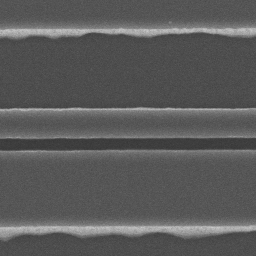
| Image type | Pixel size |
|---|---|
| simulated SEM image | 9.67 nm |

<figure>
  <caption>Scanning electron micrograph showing lines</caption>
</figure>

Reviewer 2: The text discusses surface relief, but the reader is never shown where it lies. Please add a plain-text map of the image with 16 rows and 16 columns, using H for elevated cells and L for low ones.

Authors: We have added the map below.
HHHHHHHHHHHHHHHH
HHHHHHHHHHHHHHHH
LLLLLLLLLLLLLLLL
LLLLLLLLLLLLLLLL
LLLLLLLLLLLLLLLL
LLLLLLLLLLLLLLLL
LLLLLLLLLLLLLLLL
HHHHHHHHHHHHHHHH
HHHHHHHHHHHHHHHH
HHHHHHHHHHHHHHHH
HHHHHHHHHHHHHHHH
HHHHHHHHHHHHHHHH
HHHHHHHHHHHHHHHH
HHHHHHHHHHHHHHHH
LLLLLLLLLLLLLLLL
LLLLLLLLLLLLLLLL